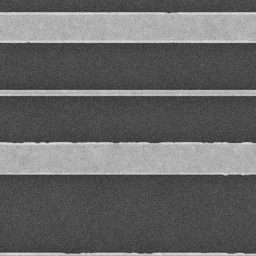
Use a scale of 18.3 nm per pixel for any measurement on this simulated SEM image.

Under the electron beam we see lines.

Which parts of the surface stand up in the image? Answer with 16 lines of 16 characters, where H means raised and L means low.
LLLLLLLLLLLLLLLL
HHHHHHHHHHHHHHHH
HHHHHHHHHHHHHHHH
LLLLLLLLLLLLLLLL
LLLLLLLLLLLLLLLL
LLLLLLLLLLLLLLLL
LLLLLLLLLLLLLLLL
LLLLLLLLLLLLLLLL
LLLLLLLLLLLLLLLL
HHHHHHHHHHHHHHHH
HHHHHHHHHHHHHHHH
LLLLLLLLLLLLLLLL
LLLLLLLLLLLLLLLL
LLLLLLLLLLLLLLLL
LLLLLLLLLLLLLLLL
LLLLLLLLLLLLLLLL